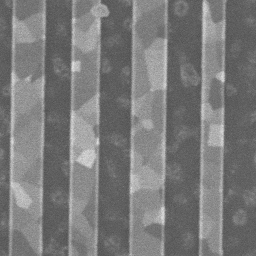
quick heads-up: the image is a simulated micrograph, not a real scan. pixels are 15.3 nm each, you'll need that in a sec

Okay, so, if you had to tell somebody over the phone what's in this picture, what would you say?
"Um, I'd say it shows one or a few lines or trenches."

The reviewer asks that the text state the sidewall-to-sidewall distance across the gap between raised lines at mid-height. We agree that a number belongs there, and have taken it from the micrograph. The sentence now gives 0.52 um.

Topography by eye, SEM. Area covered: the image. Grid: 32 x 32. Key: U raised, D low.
DDUUUUDDDUUUUDDDDUUUUDDDDDUUDDDD
DDUUUUDDDUUUUUDDDUUUUDDDDUUUDDDD
DDUUUUDDDUUUUDDDDUUUUDDDDUUUDDDD
DDUUUUDDDUUUDDDDDUUUUDDDDUUUDDDD
DDUUUUDDDUUUDDDDDUUUUDDDDUUUDDDD
DDUUUUDDDUUUDDDDDUUUUDDDDUUUDDDD
DDUUUUDDDUUUDDDDDUUUUDDDDUUUDDDD
DDUUUDDDDUUUDDDDDUUUUDDDDUUUDDDD
DDUUUDDDDUUUDDDDDUUUUDDDDUUUDDDD
DDUUUDDDDUUUDDDDDUUUUDDDDUUUDDDD
DDUUUDDDDUUUDDDDDUUUUDDDDUUUDDDD
DDUUUDDDDUUUDDDDDUUUUDDDDUUUDDDD
DDUUUDDDDUUUDDDDUUUUUDDDDUUUDDDD
DDUUUDDDDUUUDDDDUUUUUDDDDUUUDDDD
DDUUUDDDDUUUDDDDDUUUUDDDDUUUDDDD
DUUUUDDDDUUUDDDDDUUUUDDDDUUUDDDD
DUUUUDDDDUUUDDDDDUUUUDDDDUUUDDDD
DUUUUDDDDUUUDDDDDUUUUDDDDUUUDDDD
DUUUUDDDDUUUDDDDDUUUUDDDDUUUDDDD
DUUUUDDDDUUUDDDDDUUUUDDDDUUUDDDD
DUUUUDDDDUUUDDDDUUUUDDDDDUUUDDDD
DUUUUDDDDUUUDDDDUUUUDDDDDUUUDDDD
DUUUUDDDDUUUDDDDUUUUDDDDDUUUDDDD
DUUUUDDDDUUUDDDDUUUUDDDDDUUUDDDD
DUUUUDDDDUUUDDDDUUUUDDDDDUUUDDDD
DUUUUDDDDUUUDDDDUUUUDDDDDUUUDDDD
DUUUUDDDDUUUDDDDUUUUDDDDDUUUDDDD
DUUUUDDDDUUUDDDDUUUUDDDDDUUUDDDD
DUUUUDDDDUUUDDDDUUUUDDDDDUUUDDDD
DUUUUDDDDUUUDDDDUUUUDDDDDUUUDDDD
DUUUUDDDDUUUDDDDUUUUDDDDDUUUDDDD
DUUUUDDDDUUUDDDDUUUUDDDDDUUUDDDD